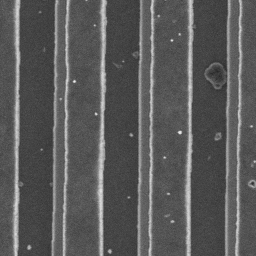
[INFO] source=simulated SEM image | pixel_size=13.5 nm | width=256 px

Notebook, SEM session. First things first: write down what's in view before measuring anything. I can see lines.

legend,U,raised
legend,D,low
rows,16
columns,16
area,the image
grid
UDDDUUUDDUUUDDUU
UDDDUUUDDUUUDDUU
UDDUUUUDDUUUDDUU
UDDUUUDDDUUUDDUU
UDDUUUDDDUUUDDUU
UDDUUUDDDUUUDDUU
UDDUUUDDDUUUDDUU
UDDUUUDDDUUUDDUU
UDDUUUDDDUUUDDUU
UDDUUUDDDUUUDDUU
UDDUUUDDDUUUDDUU
UDDUUUDDDUUUDDUU
UDDUUUDDDUUUDDUU
UDDUUUDDDUUUDDUU
UDDUUUDDDUUUDDUU
UDDUUUDDDUUUDDUU